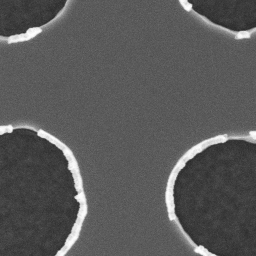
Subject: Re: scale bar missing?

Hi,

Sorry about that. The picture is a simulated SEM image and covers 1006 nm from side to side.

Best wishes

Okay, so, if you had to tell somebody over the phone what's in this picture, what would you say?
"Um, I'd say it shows holes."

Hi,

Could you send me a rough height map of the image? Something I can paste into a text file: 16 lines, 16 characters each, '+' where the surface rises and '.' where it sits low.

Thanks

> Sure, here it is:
....++++++++....
...++++++++++...
++++++++++++++++
++++++++++++++++
++++++++++++++++
++++++++++++++++
++++++++++++++++
++++++++++++++++
...+++++++++++++
....++++++++....
....+++++++.....
.....++++++.....
.....++++++.....
.....++++++.....
....++++++++....
....+++++++++...